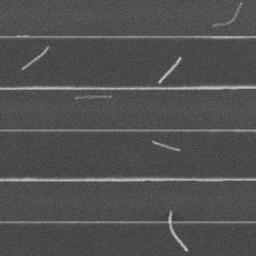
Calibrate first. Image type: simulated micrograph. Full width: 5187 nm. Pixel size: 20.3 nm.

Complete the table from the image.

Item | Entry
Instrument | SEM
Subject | lines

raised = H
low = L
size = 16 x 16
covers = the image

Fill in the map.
LLLLLLLLLLLLLLLL
LLLLLLLLLLLLLLLL
HHHHHHHHHHHHHHHH
HHHHHHHHHHHHHHHH
HHHHHHHHHHHHHHHH
HHHHHHHHHHHHHHHH
LLLLLLLLLLLLLLLL
LLLLLLLLLLLLLLLL
HHHHHHHHHHHHHHHH
HHHHHHHHHHHHHHHH
HHHHHHHHHHHHHHHH
LLLLLLLLLLLLLLLL
LLLLLLLLLLLLLLLL
LLLLLLLLLLLLLLLL
HHHHHHHHHHHHHHHH
HHHHHHHHHHHHHHHH